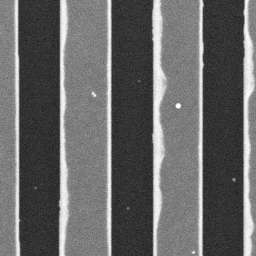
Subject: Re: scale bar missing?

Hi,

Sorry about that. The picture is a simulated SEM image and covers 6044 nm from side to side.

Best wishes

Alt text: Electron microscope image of lines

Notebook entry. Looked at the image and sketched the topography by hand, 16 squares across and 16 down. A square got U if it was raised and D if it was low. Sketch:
UDDDUUUDDDUUUDDU
UDDDUUUDDDUUUDDU
UDDDUUUDDDUUUDDU
UDDDUUUDDDUUUDDU
UDDDUUUDDDUUUDDU
UDDDUUUDDDUUUDDU
UDDDUUUDDDUUUDDU
UDDDUUUDDDUUUDDU
UDDDUUUDDDUUUDDU
UDDDUUUDDDUUUDDU
UDDDUUUDDDUUUDDU
UDDDUUUDDDUUUDDU
UDDDUUUDDDUUUDDU
UDDDUUUDDDUUUDDU
UDDDUUUDDDUUUDDU
UDDDUUUDDDUUUDDU